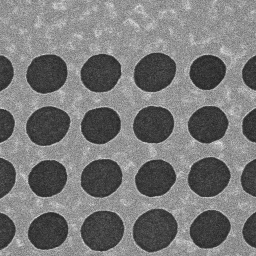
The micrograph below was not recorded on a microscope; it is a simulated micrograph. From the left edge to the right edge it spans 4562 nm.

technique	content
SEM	a regular array of holes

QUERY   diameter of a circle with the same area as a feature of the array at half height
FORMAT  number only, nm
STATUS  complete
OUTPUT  705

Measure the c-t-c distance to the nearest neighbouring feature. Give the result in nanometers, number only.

935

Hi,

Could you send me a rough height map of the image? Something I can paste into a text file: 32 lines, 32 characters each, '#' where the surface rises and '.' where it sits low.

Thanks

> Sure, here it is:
################################
################################
################################
################################
################################
################################
################################
.###....###....###....##....###.
..#.....##.....##.....##....##..
..#.....##.....##.....##....##..
.###....##.....##....###...####.
#####..#####.###################
################################
#####..#####..####..#####..#####
..##.....##....##.....##....###.
..#......#.....##.....##.....#..
..#.....##.....##.....##....##..
.###....###...####...####..####.
################################
################################
.####...###....###...###....###.
..##....##.....##.....##.....#..
..#.....##.....##.....#......#..
..##....##.....##....###....##..
.####..####..#####..#####..#####
################################
############..####...####..#####
.###....###....##.....##.....##.
..##....##.....##.....##.....#..
..##....##.....##.....##....##..
.###....###....##....###....###.
##################.#############